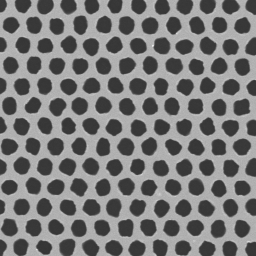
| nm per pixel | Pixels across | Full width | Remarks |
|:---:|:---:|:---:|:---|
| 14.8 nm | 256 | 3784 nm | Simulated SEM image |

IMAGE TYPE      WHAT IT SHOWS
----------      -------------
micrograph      a regular array of holes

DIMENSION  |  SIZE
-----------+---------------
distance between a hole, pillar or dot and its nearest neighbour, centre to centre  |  333 nm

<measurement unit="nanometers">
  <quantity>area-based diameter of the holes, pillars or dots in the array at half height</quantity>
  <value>235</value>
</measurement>